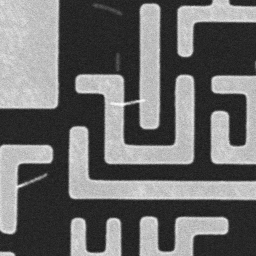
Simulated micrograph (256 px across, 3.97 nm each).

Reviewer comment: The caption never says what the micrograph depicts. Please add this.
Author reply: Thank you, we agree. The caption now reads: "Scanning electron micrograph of wiring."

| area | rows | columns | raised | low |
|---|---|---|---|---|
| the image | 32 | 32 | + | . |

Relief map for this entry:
+++++++...................+++...
+++++++...........++..++++++++++
+++++++...........++..++++++++++
+++++++...........++..++........
+++++++...........++..++........
+++++++...........++..++........
+++++++...........++..++........
+++++++...........++............
+++++++...........++............
+++++++...+++++...++...+........
+++++++...+++++...++..++...+++++
+++++++...+++++...++..++...+++++
+++++++......+++.+++..++.......+
.............+++..++..++.......+
.............++...++..++..+++..+
.............++...++..++..+++..+
.........++..++.......++..+++..+
.........++..+++......++..+++..+
++++++...++..+++++++++++..++++++
++++++...++..+++++++++++..++++++
+++......++.....................
++.......++.....................
++.......+++....................
++.......+++++++++++++++++++++++
++.......+++++++++++++++++++++++
++..............................
++..............................
++.......+....+...++..++++++....
++.......++..++...++..++++++....
.........++..++...++..++........
.........++..++...++..++........
.........++..++...++++++........